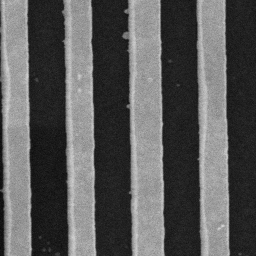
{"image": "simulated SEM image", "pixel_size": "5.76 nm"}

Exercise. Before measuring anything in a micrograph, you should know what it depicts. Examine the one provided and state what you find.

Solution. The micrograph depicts lines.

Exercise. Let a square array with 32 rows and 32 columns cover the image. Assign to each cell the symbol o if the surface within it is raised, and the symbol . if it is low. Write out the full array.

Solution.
ooo.....ooo.....oooo.....ooo....
ooo.....ooo.....oooo.....ooo....
ooo.....ooo.....oooo.....ooo....
ooo.....ooo.....oooo.....ooo....
ooo.....ooo.....oooo.....ooo....
oooo....ooo.....oooo.....ooo....
oooo....oooo....oooo.....ooo....
oooo....oooo....oooo.....ooo....
oooo....oooo....oooo.....ooo....
oooo....oooo....oooo.....ooo....
.ooo....oooo....oooo.....ooo....
.ooo....oooo....oooo.....ooo....
.ooo....oooo....oooo.....ooo....
oooo.....ooo....oooo.....ooo....
.ooo.....ooo....oooo.....ooo....
oooo.....ooo....oooo.....ooo....
oooo.....ooo.....ooo.....ooo....
oooo.....ooo.....ooo.....ooo....
.ooo.....ooo.....ooo.....ooo....
.ooo.....ooo.....ooo.....ooo....
.ooo.....ooo.....ooo.....ooo....
.ooo.....ooo.....ooo.....ooo....
.ooo.....ooo.....ooo.....ooo....
.ooo.....ooo.....ooo.....oooo...
.ooo.....ooo.....ooo.....oooo...
.ooo.....ooo.....ooo.....oooo...
.ooo.....ooo.....ooo.....oooo...
.ooo.....ooo.....ooo.....oooo...
.ooo.....ooo.....oooo....oooo...
.ooo.....ooo.....oooo....oooo...
.ooo.....ooo.....ooo.....oooo...
.ooo.....ooo.....oooo....oooo...